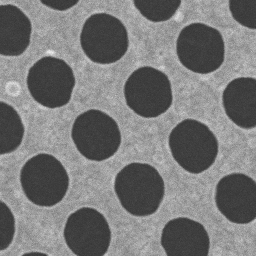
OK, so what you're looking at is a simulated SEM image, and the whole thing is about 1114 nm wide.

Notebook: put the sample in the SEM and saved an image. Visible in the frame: a regular array of holes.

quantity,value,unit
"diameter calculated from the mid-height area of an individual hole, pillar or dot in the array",218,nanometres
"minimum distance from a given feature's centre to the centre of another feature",298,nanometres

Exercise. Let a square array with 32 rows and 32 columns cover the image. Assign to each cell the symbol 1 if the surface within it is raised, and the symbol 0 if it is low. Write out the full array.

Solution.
11111000011111111000000111111000
00011111111111111000001111111000
00001111111000011110011111111000
00001111110000001111111000011110
00001111110000001111110000001111
00001111110000001111110000001111
00011111111000001111110000001111
11111000111000011111110000001111
11110000011111111001111000011111
11100000011111110000011111111111
11100000011111110000011111111000
11110000011111100000011111110000
11110000011111110000001111110000
00111101111111110000011111110000
00111111110000111100111111111000
00011111100000011111110001111000
00011111100000011111100000111111
00011111100000011111100000011111
00111111110000011111100000011111
11110001110000111111110000011111
11100000111111110001110000011111
11100000111111100000111101111111
11100000011111000000111111110000
11100000011111000000011111100000
11100000111111100000011111100000
01110001111111100000111111100000
01111111100011110001111111110000
00111111000001111111100011111000
00111111000000111111000000111111
00111111000000111111000000111111
01111111000000111111000000111111
11110111100001111111100000111111